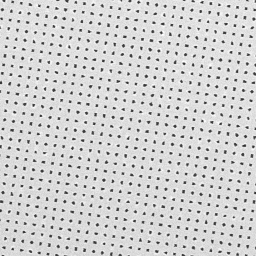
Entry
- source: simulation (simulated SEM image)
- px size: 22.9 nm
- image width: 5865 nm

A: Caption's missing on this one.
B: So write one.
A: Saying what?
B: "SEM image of a regular array of holes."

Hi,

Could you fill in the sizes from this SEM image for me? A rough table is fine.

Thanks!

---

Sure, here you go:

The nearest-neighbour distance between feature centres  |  196 nm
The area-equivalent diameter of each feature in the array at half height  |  77.6 nm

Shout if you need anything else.